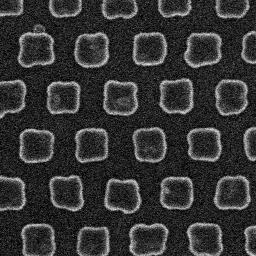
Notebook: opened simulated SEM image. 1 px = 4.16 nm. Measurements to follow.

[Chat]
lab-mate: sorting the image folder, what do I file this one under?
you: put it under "a regular array of raised bodies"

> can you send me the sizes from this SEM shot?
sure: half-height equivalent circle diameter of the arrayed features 146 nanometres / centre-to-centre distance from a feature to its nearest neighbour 227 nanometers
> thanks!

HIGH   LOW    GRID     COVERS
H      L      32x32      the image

HHHLLLHHHHLLLHHHHLLLHHHHLLLHHHHL
HHHLLLHHHHLLLHHHHLLLHHHHLLLHHHHL
LLLLLLLLLLLLLLLLLLLLLLLLLLLLLLLL
LLLLLLLLLLLLLLLLLLLLLLLLLLLLLLLL
LLLHHHLLLLHHHLLLLHHHLLLLHHHLLLLH
LLLHHHHLLHHHHHLLLHHHHLLHHHHHLLHH
LLLHHHHLLHHHHLLLLHHHHLLHHHHHLLHH
LLHHHHHLLHHHHLLLLHHHLLLHHHHLLLLH
LLLLLLLLLLLLLLLLLLLLLLLLLLLLLLLL
LLLLLLLLLLLLLLLLLLLLLLLLLLLLLLLL
HHHLLLLHHHLLLHHHHLLLHHHHLLLHHHHL
HHHLLLHHHHLLLHHHHLLLHHHHLLLHHHHL
HHHLLLHHHHLLLHHHHLLLHHHHLLLHHHHL
HHHLLLHHHHLLLHHHHLLLHHHHLLLHHHHL
LLLLLLLLLLLLLLLLLLLLLLLLLLLLLLLL
LLLLLLLLLLLLLLLLLLLLLLLLLLLLLLLL
LLLHHHLLLLHHHLLLLHHHLLLLHHHLLLLH
LLLHHHHLLLHHHLLLLHHHHLLLHHHLLLLH
LLLHHHHLLLHHHLLLLHHHHLLLHHHHLLLH
LLLHHHHLLHHHHLLLLHHHLLLLHHHLLLLH
LLLLLLLLLLLLLLLLLLLLLLLLLLLLLLLL
LLLLLLLLLLLLLLLLLLLLLLLLLLLLLLLL
HHLLLLHHHHLLLLHLLLLLLHHHLLLLHHHL
HHHLLLHHHHLLLHHHHLLLHHHHLLLHHHHL
HHHLLLHHHHLLLHHHHLLLHHHHLLLHHHHL
HHHLLLLHHHLLLHHHHLLLHHHHLLLHHHHL
LLLLLLLLLLLLLLLLHLLLLLLLLLLLLLLL
LLLLLLLLLLLLLLLLLLLLLLLLLLLLLLLL
LLLHHHLLLLLHHLLLLHHHHLLLHHHHLLLH
LLLHHHHLLLHHHLLLHHHHHLLLHHHHLLLH
LLLHHHHLLLHHHHLLHHHHHLLLHHHHLLLH
LLLHHHHLLLHHHLLLHHHHLLLLHHHHLLLH